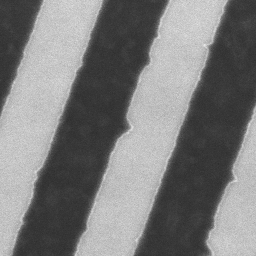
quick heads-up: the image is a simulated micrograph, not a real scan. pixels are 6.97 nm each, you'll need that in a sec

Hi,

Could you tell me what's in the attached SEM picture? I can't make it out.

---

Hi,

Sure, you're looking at one or a few lines or trenches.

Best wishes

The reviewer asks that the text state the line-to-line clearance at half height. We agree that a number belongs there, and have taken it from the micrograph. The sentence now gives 371 nanometres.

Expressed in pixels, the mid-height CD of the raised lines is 64.3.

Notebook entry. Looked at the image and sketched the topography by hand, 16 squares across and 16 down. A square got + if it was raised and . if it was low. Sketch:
+++...++++....++
++....++++....++
++...+++++...+++
+....++++....+++
+....++++....+++
+...+++++...++++
....++++....++++
....++++...+++++
...+++++...++++.
...++++....++++.
..+++++...+++++.
..++++....++++..
..++++....++++..
.+++++...+++++..
.++++....++++...
.++++...+++++...